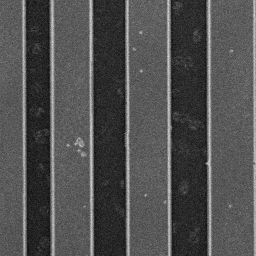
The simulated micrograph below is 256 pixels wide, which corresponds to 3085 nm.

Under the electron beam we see one or a few lines or trenches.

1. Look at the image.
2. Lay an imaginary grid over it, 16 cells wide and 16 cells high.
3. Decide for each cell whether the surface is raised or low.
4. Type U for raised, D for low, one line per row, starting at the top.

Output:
UDDUUUDDUUDDDUUU
UDDUUUDDUUDDDUUU
UDDUUUDDUUDDDUUU
UDDUUUDDUUDDDUUU
UDDUUUDDUUDDDUUU
UDDUUUDDUUDDDUUU
UDDUUUDDUUDDDUUU
UDDUUUDDUUUDDUUU
UDDUUUDDUUUDDUUU
UDDUUUDDUUUDDUUU
UDDUUUDDUUUDDUUU
UDDUUUDDUUUDDUUU
UDDUUUDDUUUDDUUU
UDDUUUDDUUUDDUUU
UDDUUUDDUUUDDUUU
UDDUUUDDUUUDDUUU